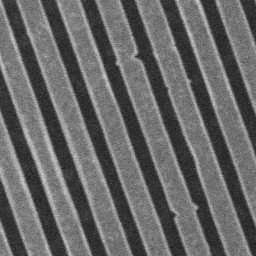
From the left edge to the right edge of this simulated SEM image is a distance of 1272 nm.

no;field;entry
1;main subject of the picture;parallel lines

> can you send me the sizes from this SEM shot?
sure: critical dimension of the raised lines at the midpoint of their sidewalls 0.108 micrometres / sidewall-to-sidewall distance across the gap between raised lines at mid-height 0.0778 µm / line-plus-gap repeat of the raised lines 0.186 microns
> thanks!